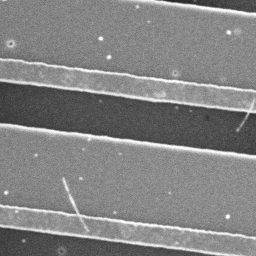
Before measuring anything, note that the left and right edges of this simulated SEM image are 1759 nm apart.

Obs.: lines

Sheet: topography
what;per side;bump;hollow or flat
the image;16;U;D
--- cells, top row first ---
UUUUUUUUUUUUUDDD
UUUUUUUUUUUUUUUU
UUUUUUUUUUUUUUUU
UUUUUUUUUUUUUUUU
UUUUUUUUUUUUUUUU
DDDDUUUUUUUUUUUU
DDDDDDDDDDDUUUUU
DDDDDDDDDDDDDDDD
UUUUUUDDDDDDDDDD
UUUUUUUUUUUUUUDD
UUUUUUUUUUUUUUUU
UUUUUUUUUUUUUUUU
UUUUUUUUUUUUUUUU
UUUUUUUUUUUUUUUU
DDDUUUUUUUUUUUUU
DDDDDDDDDDDUUUUU